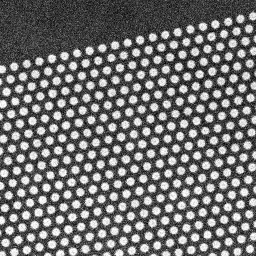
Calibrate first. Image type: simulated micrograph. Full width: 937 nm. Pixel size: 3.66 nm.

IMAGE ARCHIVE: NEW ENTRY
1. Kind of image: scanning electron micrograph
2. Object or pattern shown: a regular array of raised bodies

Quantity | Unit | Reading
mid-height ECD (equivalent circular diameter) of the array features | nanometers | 26.4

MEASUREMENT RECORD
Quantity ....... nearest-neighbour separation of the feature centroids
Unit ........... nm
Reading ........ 46.4